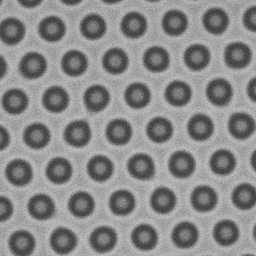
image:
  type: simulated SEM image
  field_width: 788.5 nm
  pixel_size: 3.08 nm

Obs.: an array of small figures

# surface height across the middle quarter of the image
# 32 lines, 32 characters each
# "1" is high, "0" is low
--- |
00000011110000001111000000111100
00000011110000001111100000111110
00000111111100111111111111111111
11111111111111111111111111111111
11111111111111111101111111000011
11111110001111110000011111000001
01111000000111100000001110000000
01111000000011100000001110000000
01111000000011100000001110000000
01111000000111100000001111000001
01111000000111110000011111100011
11111000001111111111111111111111
11111110111111111111111111111111
11111111111110111111110000111110
10000011111000001111100000011110
00000001111000000111100000011110
00000001110000000111000000011110
00000001110000000111100000011110
00000001111000000111100000011111
00000011111000001111110001111111
10000011111110011111111111111111
11111111111111111111111111110011
11111111111111111000011111100000
11111110000111110000001111000000
01111100000011110000000111000000
00111100000001100000000111000000
00111100000001110000000111000000
00111100000011110000000111100000
00111110000011111000001111110001
01111111001111111111111111111111
11111111111111111111111101111111
11111111111110001111110000011111